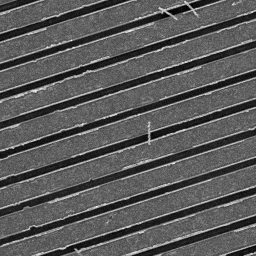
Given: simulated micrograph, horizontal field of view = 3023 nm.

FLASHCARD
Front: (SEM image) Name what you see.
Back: parallel lines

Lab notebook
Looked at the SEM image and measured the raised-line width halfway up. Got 249 nm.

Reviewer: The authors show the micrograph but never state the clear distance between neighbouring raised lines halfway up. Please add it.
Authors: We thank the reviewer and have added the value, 0.0759 microns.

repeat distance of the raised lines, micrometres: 0.329